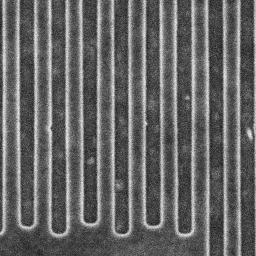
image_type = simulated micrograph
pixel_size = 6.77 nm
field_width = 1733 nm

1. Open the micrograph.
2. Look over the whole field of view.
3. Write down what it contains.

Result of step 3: parallel lines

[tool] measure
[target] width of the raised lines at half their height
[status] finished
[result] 0.107 microns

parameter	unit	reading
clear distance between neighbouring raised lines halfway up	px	14.9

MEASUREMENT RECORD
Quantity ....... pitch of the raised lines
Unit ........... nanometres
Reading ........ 214